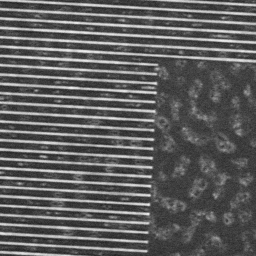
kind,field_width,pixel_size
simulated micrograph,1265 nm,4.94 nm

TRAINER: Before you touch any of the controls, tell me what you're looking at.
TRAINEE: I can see parallel lines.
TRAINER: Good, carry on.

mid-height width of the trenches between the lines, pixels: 7.85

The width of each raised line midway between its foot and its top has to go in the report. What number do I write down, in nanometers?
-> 8.6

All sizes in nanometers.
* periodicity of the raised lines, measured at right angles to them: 46.1